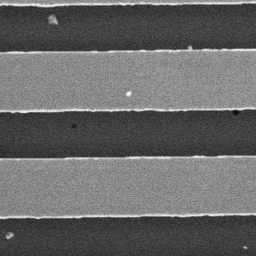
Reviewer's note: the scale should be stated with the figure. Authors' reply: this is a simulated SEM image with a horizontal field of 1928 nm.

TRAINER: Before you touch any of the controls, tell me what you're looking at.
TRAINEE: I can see lines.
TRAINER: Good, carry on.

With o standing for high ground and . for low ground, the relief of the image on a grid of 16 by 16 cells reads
................
................
................
oooooooooooooooo
oooooooooooooooo
oooooooooooooooo
oooooooooooooooo
................
................
................
oooooooooooooooo
oooooooooooooooo
oooooooooooooooo
ooooooooo..o....
................
................